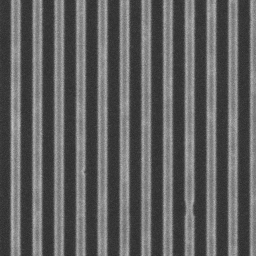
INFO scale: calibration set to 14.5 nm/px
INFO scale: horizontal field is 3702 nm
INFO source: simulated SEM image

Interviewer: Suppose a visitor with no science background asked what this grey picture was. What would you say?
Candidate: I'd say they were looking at parallel lines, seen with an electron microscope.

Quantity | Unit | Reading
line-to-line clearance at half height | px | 13.4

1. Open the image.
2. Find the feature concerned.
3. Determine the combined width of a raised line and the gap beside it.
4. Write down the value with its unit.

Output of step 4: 314 nanometres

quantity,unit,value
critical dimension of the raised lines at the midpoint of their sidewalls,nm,118